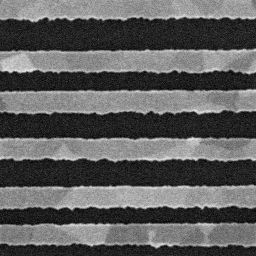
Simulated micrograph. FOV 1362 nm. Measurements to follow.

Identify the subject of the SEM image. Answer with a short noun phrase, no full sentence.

lines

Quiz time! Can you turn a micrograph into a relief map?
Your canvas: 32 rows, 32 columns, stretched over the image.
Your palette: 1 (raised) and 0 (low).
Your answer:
11111111111111111111111111111111
11111111111111111111111111111111
00001000000000000000000000000000
00000000000000000000000000000000
00000000000000000000000000000000
00000000000000000000000000000000
01100111000111111111111111111111
11111111111111111111111111111111
11111111111111111111111111111111
00000000000000000000000000000000
00000000000000000000000000000000
11111111111111111111111111111111
11111111111111111111111111111111
11111111111111111111111111111111
00000000000000000000000000000000
00000000000000000000000000000000
00000000000000000000000000000000
11111111111111111111111111111111
11111111111111111111111111111111
11111111111111111111111111111111
00000000000000000000000000000000
00000000000000000000000000000000
00000000000000000000000000000000
11111111011111111111111111111111
11111111111111111111111111111111
11111111111111111111111111111111
00000000000000000000000000000000
00000000000000000000000000000000
11111111111111111111111111111111
11111111111111111111111111111111
01111111101101111111111111111111
00000000000000000000000000000000